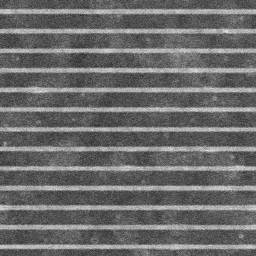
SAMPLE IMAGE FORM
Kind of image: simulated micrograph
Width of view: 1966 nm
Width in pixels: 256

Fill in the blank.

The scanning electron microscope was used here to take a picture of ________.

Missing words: parallel lines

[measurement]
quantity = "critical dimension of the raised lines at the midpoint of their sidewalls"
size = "26.9 nm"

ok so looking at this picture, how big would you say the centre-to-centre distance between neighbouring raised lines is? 0.15 microns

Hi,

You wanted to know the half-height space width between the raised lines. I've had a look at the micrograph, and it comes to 126 nm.